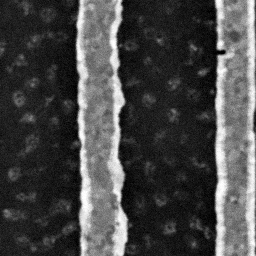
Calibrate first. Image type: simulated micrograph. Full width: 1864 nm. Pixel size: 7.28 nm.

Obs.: one or a few lines or trenches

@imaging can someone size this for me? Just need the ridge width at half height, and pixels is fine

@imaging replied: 33.7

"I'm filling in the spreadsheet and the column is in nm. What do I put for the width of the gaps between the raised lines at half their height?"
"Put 742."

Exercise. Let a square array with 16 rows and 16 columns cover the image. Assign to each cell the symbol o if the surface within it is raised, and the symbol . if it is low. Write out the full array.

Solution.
.....oo.......oo
.....oo.......oo
.....oo.......oo
.....oo.......oo
.....oo.......oo
.....oo.......oo
.....oo.......oo
.....oo.......oo
.....oo.......oo
.....oo.......oo
.....oo.......oo
.....oo.......oo
.....oo.......oo
.....ooo......oo
.....ooo......oo
.....ooo......oo